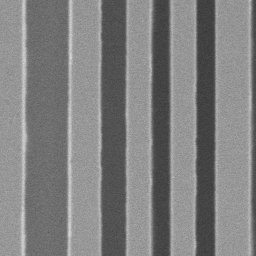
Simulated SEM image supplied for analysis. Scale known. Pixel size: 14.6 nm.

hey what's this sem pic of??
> lines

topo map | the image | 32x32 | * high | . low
***......****...***..***...****.
***......****...***..***...****.
***......****...***..***...****.
***......****...***..***...****.
***......***....***..***...****.
***......****...***..***...****.
***......****...***..***...****.
***......****...***..***...****.
***......****...***..***...****.
***......***....***..***...****.
***......***....***..***...****.
***......***....***..***...****.
***......***....***..***...****.
***......***....***..***...****.
***......****...***..***...****.
***......****...***..***...****.
***......****...***..***...****.
***......****...***..***...****.
***......****...***..***...****.
***......***....***..***...****.
***......***....***..***...****.
***......****...***..***...****.
***......****...***..***...****.
***......***....***..***...****.
***......***....***..***...****.
***......***....***..***...****.
***......****...***..***...****.
***......****...***..***...****.
***......****...***..***...****.
***......****...***..***...****.
***......****...***..***...****.
***......****...***..***...****.